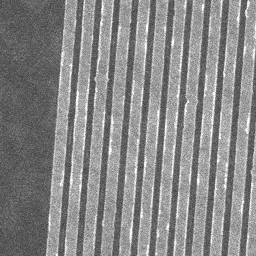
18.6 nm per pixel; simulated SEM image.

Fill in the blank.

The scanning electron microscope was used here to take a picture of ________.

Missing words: parallel lines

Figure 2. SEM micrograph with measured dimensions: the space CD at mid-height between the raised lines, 134 nm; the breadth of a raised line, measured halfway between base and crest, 0.201 micrometres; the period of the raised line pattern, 336 nm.